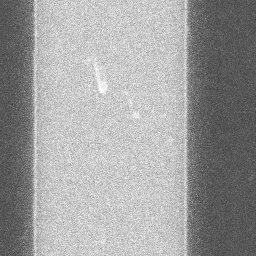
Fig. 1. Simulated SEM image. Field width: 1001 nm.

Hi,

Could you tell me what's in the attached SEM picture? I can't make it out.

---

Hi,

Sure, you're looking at one or a few lines or trenches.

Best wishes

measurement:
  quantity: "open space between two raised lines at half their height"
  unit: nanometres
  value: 582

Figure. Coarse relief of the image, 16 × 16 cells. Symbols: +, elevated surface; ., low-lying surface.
++..........++++
++..........++++
++..........++++
++..........++++
++..........++++
++..........++++
++..........++++
++..........++++
++..........++++
++..........++++
++..........++++
++..........++++
++..........++++
++..........++++
++..........++++
++..........++++